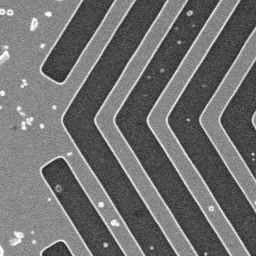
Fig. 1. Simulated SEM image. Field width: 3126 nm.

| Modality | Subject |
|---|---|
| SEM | groups of lines, slits or small figures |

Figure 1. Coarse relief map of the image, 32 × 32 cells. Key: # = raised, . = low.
##########....###....##....###..
#########....###....###....##...
#########....##....###....##....
########....###....##....###....
########....##....###....##....#
#######....##.....##....###....#
######....###....##....###....##
######....##....###....##....###
#####....###....##....###....##.
######..###....###....##....###.
##########....###....##.....##..
##########....##....###....##...
#########....###....##....###...
########.....##....###....##....
########....##.....##....###....
########....##....###....###....
########.....##....###....##....
#########....###....##....###...
##########....##....###....##...
##########....###....##.....##..
######..###....###....##....###.
#####....###....##....###....##.
######....##....###....##....###
######....###....##....###....##
#######....##.....##....###....#
########....##....###....##....#
########....###....##....###....
#########....##....###....##....
#########.....##....###....##...
##########....###....##....###..
#######.###....##....###....##..
#####....##....###....##.....##.